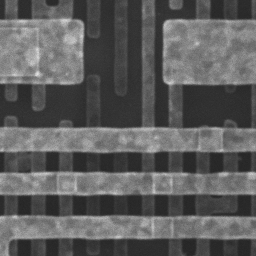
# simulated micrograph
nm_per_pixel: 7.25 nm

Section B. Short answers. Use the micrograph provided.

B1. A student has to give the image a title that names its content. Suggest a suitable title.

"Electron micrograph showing wiring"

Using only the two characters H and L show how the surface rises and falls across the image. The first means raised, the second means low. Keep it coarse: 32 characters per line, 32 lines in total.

LLLLLLLLLLLLLLLLLLLLLLLLLLLLLLLL
LLLLLLLLLLLLLLLLLLLLLLLLLLLLLLLL
LLLLLLHHLLLLLLLLLLLLLLLLLLLLLLLL
HHHHHHHHHHLLLLLLLLLLHHHHHHHHHHHH
HHHHHHHHHHLLLLLLLLLLHHHHHHHHHHHH
HHHHHHHHHHLLLLLLLLLLHHHHHHHHHHHH
HHHHHHHHHHLLLLLLLLLLHHHHHHHHHHHH
HHHHHHHHHHLLLLLLLLLLHHHHHHHHHHHH
HHHHHHHHHHLLLLLLLLLLHHHHHHHHHHHH
HHHHHHHHHHLLLLLLLLLLHHHHHHHHHHHH
LLLLLLLLLLLLLLLLLLLLLLLLHHHHHHLL
LLLLLLLLLLLLLLLLLLLLLLLLLLLLLLLL
LLLLLLLLLLLLLLLLLLLLLLLLLLLLLLLL
LLLLLLLLLLLLLLLLLLLLLLLLLLLLLLLL
LLLLLLLLLLLLLLLLLLLLLLLLLLLLLLLL
LLLLLLLLLLLLLLLLLLLLLLLLLLLLLLLL
HHHHHHHHHHHHHHHHHHHHHHHHHHHHHHHH
HHHHHHHHHHHHHHHHHHHHHHHHHHHHHHHH
HHHHHHHHHHHHHHHHHHHHHHHHHHHHHHHH
LLLLLLLLLLLLLLLLLLLLLLLLLLLLLLLL
LLLLLLLLLLLLLLLLLLLLLLLLLLLLLLLL
LLLLLLLLLLLLLLLLLLLLLLLLLLLLLLLL
HHHHHHHHHHHHHHHHHHHHHHHHHHHHHHHH
HHHHHHHHHHHHHHHHHHHHHHHHHHHHHHHH
LLLLLLLLLLLLLLLLLLLLLLLLLLLLLLLL
LLLLLLLLLLLLLLLLLLLLLLLLLLLLLLLL
LLLLLLLLLLLLLLLLLLLLLLLLLLLLLLLL
HHHHHHHHHHHHHHHHHHHHHHHHHHHHHHHH
HHHHHHHHHHHHHHHHHHHHHHHHHHHHHHHH
HHHHHHHHHHHHHHHHHHHHHHHHHHHHHHHH
HLLLLLLLLLLLLLLLLLLLLLLLLLLLLLLL
HLLLLLLLLLLLLLLLLLLLLLLLLLLLLLLL